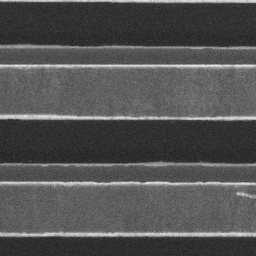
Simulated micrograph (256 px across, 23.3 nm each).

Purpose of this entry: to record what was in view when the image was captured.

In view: lines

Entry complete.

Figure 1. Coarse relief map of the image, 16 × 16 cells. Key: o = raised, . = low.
................
................
................
oooooooooooooooo
oooooooooooooooo
oooooooooooooooo
oooooooooooooooo
................
................
................
oooooooooooooooo
oooooooooooooooo
oooooooooooooooo
oooooooooooooooo
oooooooooooooooo
................